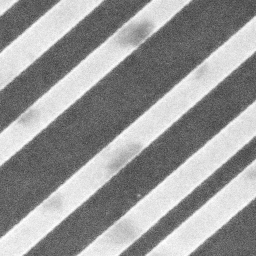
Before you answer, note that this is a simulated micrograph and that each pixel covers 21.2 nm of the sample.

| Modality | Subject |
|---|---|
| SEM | lines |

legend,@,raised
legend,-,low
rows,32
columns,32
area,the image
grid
@@-----@@@@@-------@@@@---------
@-----@@@@@------@@@@@----------
-----@@@@@------@@@@@----------@
----@@@@@------@@@@@----------@@
---@@@@@------@@@@@----------@@@
-@@@@@@------@@@@@----------@@@@
@@@@@@------@@@@-----------@@@@@
@@@@-------@@@@-----------@@@@@-
@@@------@@@@@-----------@@@@---
@@------@@@@@----------@@@@@----
@------@@@@@----------@@@@@-----
------@@@@@----------@@@@@------
-----@@@@@----------@@@@@-------
----@@@@-----------@@@@@-------@
---@@@@-----------@@@@@-------@@
-@@@@@-----------@@@@--------@@@
@@@@@----------@@@@@--------@@@@
@@@@----------@@@@@-------@@@@@-
@@@----------@@@@@-------@@@@@--
@-----------@@@@@-------@@@@@---
-----------@@@@@-------@@@@@---@
----------@@@@@-------@@@@@---@@
---------@@@@@-------@@@@@---@@@
-------@@@@@-------@@@@@----@@@@
------@@@@@-------@@@@@----@@@@@
-----@@@@@-------@@@@@----@@@@@-
----@@@@@-------@@@@@----@@@@@--
---@@@@@-------@@@@@---@@@@@@---
--@@@@@-------@@@@@---@@@@@-----
-@@@@@-------@@@@@---@@@@@------
@@@@-------@@@@@----@@@@@-------
@@@-------@@@@@----@@@@@--------